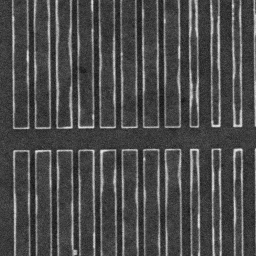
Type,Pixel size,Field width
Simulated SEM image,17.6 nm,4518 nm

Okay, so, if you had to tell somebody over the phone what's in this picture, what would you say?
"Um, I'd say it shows groups of lines, slits or small figures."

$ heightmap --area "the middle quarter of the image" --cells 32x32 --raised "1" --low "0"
11001110011100111100111001111000
11001110011100111100111001111000
11001110011100011100111001111000
11001110011100011100111001111000
11001110011110011100111001111000
11001110011110011100111001111000
11001110011110011100111001111000
11001110011100011100111001111000
10001110011100011100111001111000
10001110011110011100111001111000
11001110011110111100111001111000
11001110011110111100111001111000
11001110011110011100111001111000
11001110011110011100111001111000
11001110011110011100111001111000
11001110011110011100111001111000
00000000000000000000000000000000
00000000000000000000000000000000
00000000000000000000000000000000
00000000000000000000000000000000
00000000000000000000000000000000
00000000000000011100111101111000
11001110001110011100111101111000
11001110001110011100111101111000
11001110001110011100111101111000
11001110001110011100111100111000
11001110001110011100111000111000
11001110001110011100111000111000
11001110001110011100111000111000
11001110001110011100111000111000
11001110001110011100111000111000
11001110001110011100111000111000